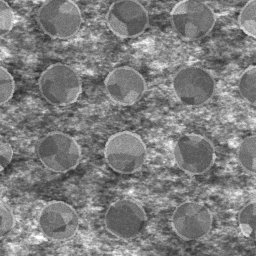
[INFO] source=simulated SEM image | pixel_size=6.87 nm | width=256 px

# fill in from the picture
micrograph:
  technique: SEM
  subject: a regular array of raised bodies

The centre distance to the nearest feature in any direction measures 456 nm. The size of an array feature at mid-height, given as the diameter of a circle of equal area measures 0.29 um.